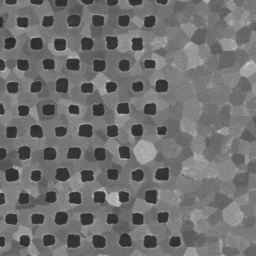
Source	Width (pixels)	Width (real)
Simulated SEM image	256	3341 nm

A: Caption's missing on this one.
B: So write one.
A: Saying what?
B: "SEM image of a regular array of holes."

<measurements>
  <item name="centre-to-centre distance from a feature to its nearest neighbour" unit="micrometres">0.317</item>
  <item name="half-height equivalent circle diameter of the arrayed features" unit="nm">173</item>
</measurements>